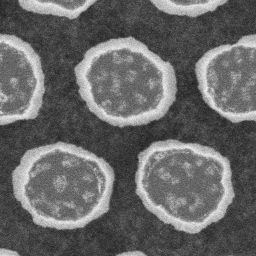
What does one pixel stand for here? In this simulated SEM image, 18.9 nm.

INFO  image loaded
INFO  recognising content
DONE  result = raised bodies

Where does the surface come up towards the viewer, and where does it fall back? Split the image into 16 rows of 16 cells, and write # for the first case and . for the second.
...##......##...
................
#...............
##....####...###
##...#####...###
##...######..###
##....####...###
#......##.......
................
...##....####...
..#####..#####..
.######..#####..
..#####..#####..
..####....###...
................
................